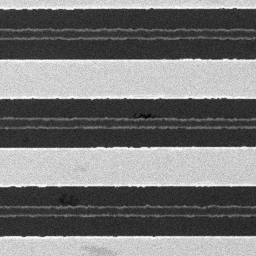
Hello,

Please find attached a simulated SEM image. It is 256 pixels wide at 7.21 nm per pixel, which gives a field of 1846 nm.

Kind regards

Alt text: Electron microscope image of lines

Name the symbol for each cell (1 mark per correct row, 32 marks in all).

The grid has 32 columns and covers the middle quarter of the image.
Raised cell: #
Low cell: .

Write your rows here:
################################
################################
################################
################################
################################
################################
################################
################################
###########.###..##############.
................................
................................
................................
................................
................................
################################
################################
................................
................................
................................
................................
................................
################################
################################
################################
################################
################################
################################
################################
################################
################################
.....#..........#.#.............
................................